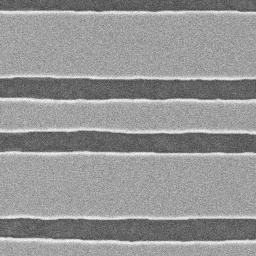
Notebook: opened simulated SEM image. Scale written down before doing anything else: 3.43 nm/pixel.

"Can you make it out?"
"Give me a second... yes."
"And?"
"lines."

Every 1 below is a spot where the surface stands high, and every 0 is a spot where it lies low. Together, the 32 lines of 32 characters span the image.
00000000000000000000000000000000
11111111111101111110111111111100
11111111111111111111111111111111
11111111111111111111111111111111
11111111111111111111111111111111
11111111111111111111111111111111
11111111111111111111111111111111
11111111111111111111111111111111
11111111111111111111111111111111
11111111111111111111111111111111
00000000000000000000000000000000
00000000000000000000000000000000
11111110011001111110111110010001
11111111111111111111111111111111
11111111111111111111111111111111
11111111111111111111111111111111
00000000000000011111111001111111
00000000000000000000000000000000
00000000000000000000000000000000
11111111111111111111111111111111
11111111111111111111111111111111
11111111111111111111111111111111
11111111111111111111111111111111
11111111111111111111111111111111
11111111111111111111111111111111
11111111111111111111111111111111
11111111111111111111111111111111
00000000000000000000000000000000
00000000000000000000000000000000
00000000000000000000000000000000
11111111111111111111111111111111
11111111111111111111111111111111